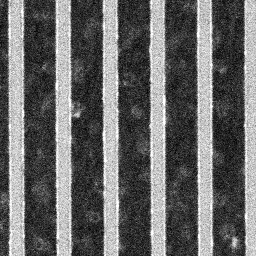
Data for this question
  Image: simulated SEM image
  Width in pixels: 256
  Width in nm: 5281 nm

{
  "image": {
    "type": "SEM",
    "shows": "parallel lines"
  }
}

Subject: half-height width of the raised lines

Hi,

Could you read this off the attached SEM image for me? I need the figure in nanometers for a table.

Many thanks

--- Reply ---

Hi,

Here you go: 727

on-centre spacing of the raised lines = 971 nm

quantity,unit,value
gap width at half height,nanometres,242